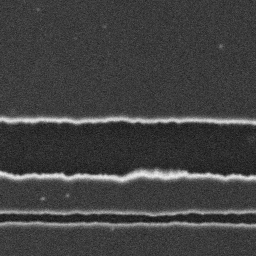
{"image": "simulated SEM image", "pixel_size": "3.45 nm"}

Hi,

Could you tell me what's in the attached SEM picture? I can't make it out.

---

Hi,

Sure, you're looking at lines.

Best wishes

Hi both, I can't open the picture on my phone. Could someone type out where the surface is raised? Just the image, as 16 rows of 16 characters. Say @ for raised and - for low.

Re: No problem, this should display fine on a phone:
@@@@@@@@@@@@@@@@
@@@@@@@@@@@@@@@@
@@@@@@@@@@@@@@@@
@@@@@@@@@@@@@@@@
@@@@@@@@@@@@@@@@
@@@@@@@@@@@@@@@@
@@@@@@@@@@@@@@@@
@@@@@@@-@@@@@@@@
----------------
----------------
----------------
@@@@@@@@@@@@@@@@
@@@@@@@@@@@@@@@@
@@@@@@@@@@@@@@@@
@@@@@@@@@@@@@@@@
@@@@@@@@@@@@@@@@